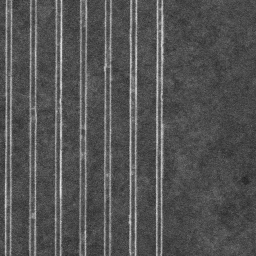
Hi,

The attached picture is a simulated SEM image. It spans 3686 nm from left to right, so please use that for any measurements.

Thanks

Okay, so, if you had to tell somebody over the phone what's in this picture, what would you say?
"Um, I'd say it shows parallel lines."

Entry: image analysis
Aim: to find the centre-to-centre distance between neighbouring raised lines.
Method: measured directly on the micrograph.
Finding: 362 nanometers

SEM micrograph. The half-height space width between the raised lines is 283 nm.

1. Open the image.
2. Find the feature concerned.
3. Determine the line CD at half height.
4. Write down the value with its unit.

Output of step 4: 84.6 nanometers